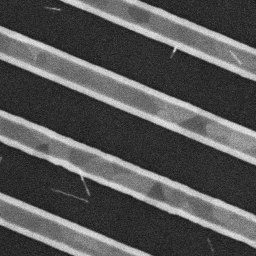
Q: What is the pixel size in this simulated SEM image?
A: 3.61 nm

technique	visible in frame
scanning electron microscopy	one or a few lines or trenches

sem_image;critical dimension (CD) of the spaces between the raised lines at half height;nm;184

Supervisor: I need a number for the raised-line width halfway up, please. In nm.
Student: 92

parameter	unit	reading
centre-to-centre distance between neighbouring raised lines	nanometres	277